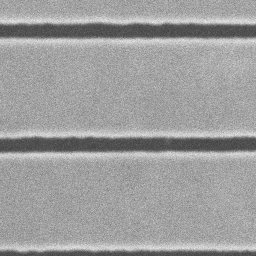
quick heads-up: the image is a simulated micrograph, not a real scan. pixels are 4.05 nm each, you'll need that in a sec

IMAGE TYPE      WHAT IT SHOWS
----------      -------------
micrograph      lines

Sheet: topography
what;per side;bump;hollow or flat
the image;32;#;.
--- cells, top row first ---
################################
################################
################################
................................
................................
################################
################################
################################
################################
################################
################################
################################
################################
################################
################################
################################
################################
................................
................................
################################
################################
################################
################################
################################
################################
################################
################################
################################
################################
################################
################################
................................